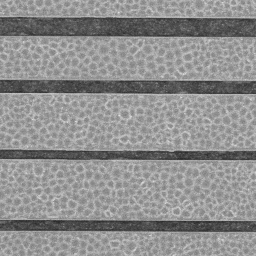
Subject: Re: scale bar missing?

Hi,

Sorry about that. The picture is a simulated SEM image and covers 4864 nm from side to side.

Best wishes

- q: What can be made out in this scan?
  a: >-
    one or a few lines or trenches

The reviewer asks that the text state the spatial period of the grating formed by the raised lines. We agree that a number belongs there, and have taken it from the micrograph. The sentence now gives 1250 nm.